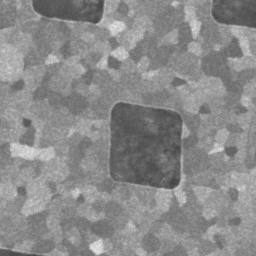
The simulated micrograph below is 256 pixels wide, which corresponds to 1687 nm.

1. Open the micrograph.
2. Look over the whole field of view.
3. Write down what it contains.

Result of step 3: holes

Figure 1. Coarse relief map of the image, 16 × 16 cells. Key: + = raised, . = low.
++.....++++++...
++++++++++++++..
++++++++++++++++
++++++++++++++++
++++++++++++++++
++++++++++++++++
+++++++.++++++++
+++++++....+++++
+++++++....+++++
+++++++....+++++
+++++++....+++++
++++++++...+++++
++++++++++++++++
++++++++++++++++
++++++++++++++++
++++++++++++++++